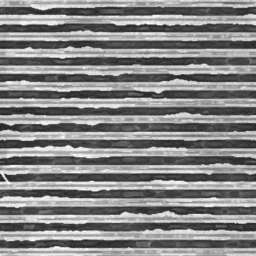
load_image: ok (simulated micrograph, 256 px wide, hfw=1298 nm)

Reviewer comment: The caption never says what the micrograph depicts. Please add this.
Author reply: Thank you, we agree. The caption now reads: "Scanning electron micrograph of parallel lines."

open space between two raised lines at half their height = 44.4 nm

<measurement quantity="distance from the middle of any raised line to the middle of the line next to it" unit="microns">0.0839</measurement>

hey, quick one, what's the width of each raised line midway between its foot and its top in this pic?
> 35.5 nm